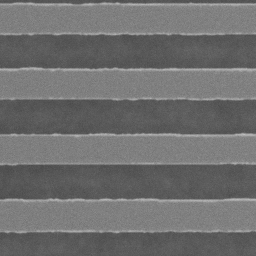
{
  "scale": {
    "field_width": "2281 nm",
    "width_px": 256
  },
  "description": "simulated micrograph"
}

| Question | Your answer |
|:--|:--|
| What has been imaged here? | lines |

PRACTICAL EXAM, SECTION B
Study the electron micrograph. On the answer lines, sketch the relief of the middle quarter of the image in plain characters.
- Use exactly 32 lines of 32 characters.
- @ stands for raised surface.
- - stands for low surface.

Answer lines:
--------------------------------
@@@@@@-@@@@@@@@-@@@@@@@-@@@@@@@@
@@@@@@@@@@@@@@@@@@@@@@@@@@@@@@@@
@@@@@@@@@@@@@@@@@@@@@@@@@@@@@@@@
@@@@@@@@@@@@@@@@@@@@@@@@@@@@@@@@
@@@@@@@@@@@@@@@@@@@@@@@@@@@@@@@@
@@@@@@@@@@@@@@@@@@@@@@@@@@@@@@@@
@@@@@@@@@@@@@@@@@@@@@@@@@@@@@@@@
@@@@@@@@@@@@@@@@@@@@@@@@@@@@@@@@
--------------------------------
--------------------------------
--------------------------------
--------------------------------
--------------------------------
--------------------------------
--------------------------------
--------------------------------
--------------------------------
@@@@@@@@@@@@@@@@@@@@@@@@@@@@@@@@
@@@@@@@@@@@@@@@@@@@@@@@@@@@@@@@@
@@@@@@@@@@@@@@@@@@@@@@@@@@@@@@@@
@@@@@@@@@@@@@@@@@@@@@@@@@@@@@@@@
@@@@@@@@@@@@@@@@@@@@@@@@@@@@@@@@
@@@@@@@@@@@@@@@@@@@@@@@@@@@@@@@@
@@@@@@@@@@@@@@@@@@@@@@@@@@@@@@@@
--------------------------------
--------------------------------
--------------------------------
--------------------------------
--------------------------------
--------------------------------
--------------------------------